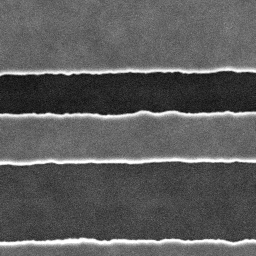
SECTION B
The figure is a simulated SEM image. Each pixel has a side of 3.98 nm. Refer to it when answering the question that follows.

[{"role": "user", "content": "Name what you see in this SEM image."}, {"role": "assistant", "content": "lines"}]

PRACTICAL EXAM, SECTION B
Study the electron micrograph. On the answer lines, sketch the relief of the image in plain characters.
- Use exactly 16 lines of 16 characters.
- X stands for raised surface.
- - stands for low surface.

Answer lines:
XXXXXXXXXXXXXXXX
XXXXXXXXXXXXXXXX
XXXXXXXXXXXXXXXX
XXXXXXXXXXXXXXXX
XXXXXXXX---XX---
----------------
----------------
XXXXXXXXXXXXXXXX
XXXXXXXXXXXXXXXX
XXXXXXXXXXXXXXXX
----------------
----------------
----------------
----------------
----------------
XXXXXXXXXXXXXXXX